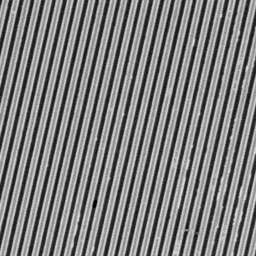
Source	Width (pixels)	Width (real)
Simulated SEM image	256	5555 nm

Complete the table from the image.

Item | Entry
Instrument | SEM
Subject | parallel lines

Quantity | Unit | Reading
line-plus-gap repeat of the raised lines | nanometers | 229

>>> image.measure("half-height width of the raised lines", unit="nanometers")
101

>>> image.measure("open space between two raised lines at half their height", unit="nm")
119